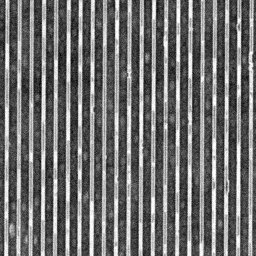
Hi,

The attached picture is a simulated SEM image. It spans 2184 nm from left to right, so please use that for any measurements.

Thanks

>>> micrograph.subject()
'parallel lines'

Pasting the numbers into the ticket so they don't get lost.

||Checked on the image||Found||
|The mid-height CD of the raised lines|0.0203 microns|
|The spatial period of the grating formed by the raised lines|0.104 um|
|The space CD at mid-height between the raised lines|79.9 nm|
